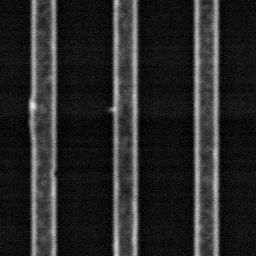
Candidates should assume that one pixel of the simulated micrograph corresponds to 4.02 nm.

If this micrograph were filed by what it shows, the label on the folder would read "one or a few lines or trenches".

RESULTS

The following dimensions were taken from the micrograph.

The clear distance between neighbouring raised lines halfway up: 242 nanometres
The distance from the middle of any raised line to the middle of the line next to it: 327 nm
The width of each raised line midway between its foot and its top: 85.3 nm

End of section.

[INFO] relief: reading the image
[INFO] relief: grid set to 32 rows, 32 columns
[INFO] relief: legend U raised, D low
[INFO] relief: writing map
DDDDUUUDDDDDDDUUUDDDDDDDDUUDDDDD
DDDDUUUDDDDDDDUUUDDDDDDDDUUDDDDD
DDDDUUUDDDDDDDUUUDDDDDDDDUUDDDDD
DDDDUUUDDDDDDDUUUDDDDDDDDUUDDDDD
DDDDUUUDDDDDDDUUUDDDDDDDDUUDDDDD
DDDDUUUDDDDDDDUUUDDDDDDDDUUDDDDD
DDDDUUUDDDDDDDUUUDDDDDDDDUUDDDDD
DDDDUUUDDDDDDDUUUDDDDDDDDUUDDDDD
DDDDUUUDDDDDDDUUUDDDDDDDDUUDDDDD
DDDDUUUDDDDDDDUUUDDDDDDDDUUDDDDD
DDDDUUUDDDDDDDUUUDDDDDDDDUUDDDDD
DDDDUUUDDDDDDDUUUDDDDDDDDUUDDDDD
DDDDUUUDDDDDDDUUUDDDDDDDDUUDDDDD
DDDDUUUDDDDDDDUUUDDDDDDDDUUDDDDD
DDDDUUUDDDDDDDUUUDDDDDDDDUUDDDDD
DDDDUUUDDDDDDDUUUDDDDDDDDUUDDDDD
DDDDUUUDDDDDDDUUUDDDDDDDDUUDDDDD
DDDDUUUDDDDDDDUUUDDDDDDDDUUDDDDD
DDDDUUUDDDDDDDUUUDDDDDDDDUUDDDDD
DDDDUUUDDDDDDDUUUDDDDDDDDUUDDDDD
DDDDUUUDDDDDDDUUUDDDDDDDDUUDDDDD
DDDDUUUDDDDDDDUUUDDDDDDDDUUDDDDD
DDDDUUUDDDDDDDUUUDDDDDDDDUUDDDDD
DDDDUUUDDDDDDDUUUDDDDDDDDUUDDDDD
DDDDUUUDDDDDDDUUUDDDDDDDDUUDDDDD
DDDDUUUDDDDDDDUUUDDDDDDDDUUDDDDD
DDDDUUUDDDDDDDUUUDDDDDDDDUUDDDDD
DDDDUUUDDDDDDDDUUDDDDDDDDUUDDDDD
DDDDUUUDDDDDDDDUUDDDDDDDDUUDDDDD
DDDDUUUDDDDDDDUUUDDDDDDDDUUDDDDD
DDDDUUUDDDDDDDUUUDDDDDDDDUUDDDDD
DDDDUUUDDDDDDDUUUDDDDDDDDUUDDDDD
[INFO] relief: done